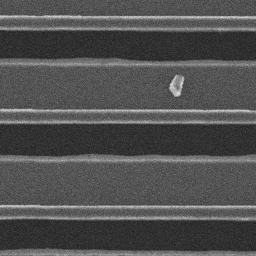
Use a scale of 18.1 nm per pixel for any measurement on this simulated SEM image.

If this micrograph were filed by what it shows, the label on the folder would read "lines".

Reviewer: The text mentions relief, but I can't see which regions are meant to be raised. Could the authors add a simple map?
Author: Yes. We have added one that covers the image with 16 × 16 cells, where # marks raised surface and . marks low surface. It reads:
################
################
................
................
################
################
################
################
................
................
################
################
################
################
................
................